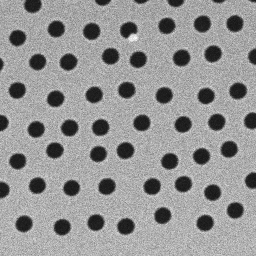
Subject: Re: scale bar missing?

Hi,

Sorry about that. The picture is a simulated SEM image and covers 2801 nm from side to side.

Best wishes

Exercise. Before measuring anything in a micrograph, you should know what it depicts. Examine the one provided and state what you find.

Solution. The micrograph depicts a regular array of holes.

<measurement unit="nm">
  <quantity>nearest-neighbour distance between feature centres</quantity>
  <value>341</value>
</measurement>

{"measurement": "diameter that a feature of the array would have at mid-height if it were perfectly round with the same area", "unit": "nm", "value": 186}